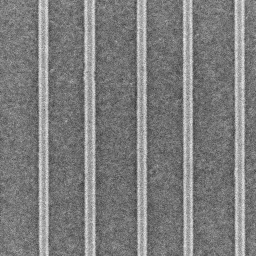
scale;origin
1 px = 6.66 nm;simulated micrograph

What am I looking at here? parallel lines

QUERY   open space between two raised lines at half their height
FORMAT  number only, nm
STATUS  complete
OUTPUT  280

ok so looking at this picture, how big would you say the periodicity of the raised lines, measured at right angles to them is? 327 nm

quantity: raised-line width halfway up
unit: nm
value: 45.8